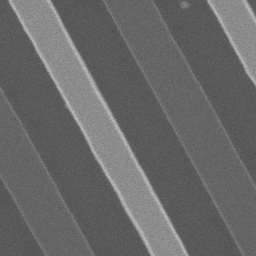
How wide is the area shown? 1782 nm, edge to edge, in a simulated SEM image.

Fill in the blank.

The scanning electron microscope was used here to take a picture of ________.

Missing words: lines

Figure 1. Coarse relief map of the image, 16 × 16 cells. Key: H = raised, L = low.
LHHLLLLHHHLLLHHH
LHHHLLLHHHLLLLHH
LLHHLLLLHHHLLLHH
LLHHHLLLHHHLLLLH
LLLHHHLLLHHHLLLH
LLLLHHLLLHHHHLLL
HLLLHHHLLLHHHLLL
HLLLLHHLLLLHHHLL
HHLLLHHHLLLHHHLL
HHLLLLHHLLLLHHHL
HHHLLLHHHLLLHHHL
HHHLLLLHHLLLLHHH
LHHHLLLHHHLLLHHH
LHHHHLLLHHLLLLHH
LLHHHLLLLHHLLLHH
LLLHHHLLLHHHLLLH